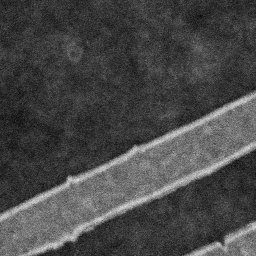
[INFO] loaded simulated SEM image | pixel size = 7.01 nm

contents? one or a few lines or trenches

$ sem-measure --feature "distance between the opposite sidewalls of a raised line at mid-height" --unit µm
0.319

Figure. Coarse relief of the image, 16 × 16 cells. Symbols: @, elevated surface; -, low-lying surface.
----------------
----------------
----------------
----------------
----------------
----------------
---------------@
-------------@@@
-----------@@@@@
--------@@@@@@@-
------@@@@@@@---
----@@@@@@@-----
--@@@@@@@-------
@@@@@@@---------
@@@@@----------@
@@@----------@@@